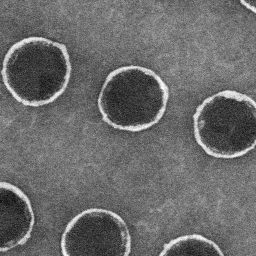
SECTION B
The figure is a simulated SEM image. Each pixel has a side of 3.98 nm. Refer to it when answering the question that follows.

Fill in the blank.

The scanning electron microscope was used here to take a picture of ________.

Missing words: raised bodies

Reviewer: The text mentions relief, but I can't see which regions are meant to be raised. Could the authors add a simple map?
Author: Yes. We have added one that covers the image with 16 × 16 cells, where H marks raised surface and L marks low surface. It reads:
LLLLLLLLLLLLLLLL
LLLLLLLLLLLLLLLL
LLHLLLLLLLLLLLLL
HHHHLLLLLLLLLLLL
HHHHLLLHHLLLLLLL
LHHHLLHHHHLLLLLL
LLHLLLHHHHLLLHHH
LLLLLLLHHHLLHHHH
LLLLLLLLLLLLHHHH
LLLLLLLLLLLLLHHL
LLLLLLLLLLLLLLLL
LLLLLLLLLLLLLLLL
HHLLLLLLLLLLLLLL
HHLLLHHLLLLLLLLL
HHLLHHHHLLLLLLLL
HLLLHHHHLLHHHHLL